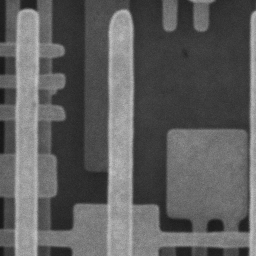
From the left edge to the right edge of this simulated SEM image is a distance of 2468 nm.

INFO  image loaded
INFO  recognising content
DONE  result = wiring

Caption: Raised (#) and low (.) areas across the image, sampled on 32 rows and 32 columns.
................................
...#...........#................
..###.........##...............#
..###.........###..............#
..###.........###..............#
..###.........###..............#
..###.........###..............#
..###.........###..............#
..###.........###..............#
..###.........###..............#
..###.........###..............#
..###.........###..............#
..###.........###..............#
..###.........###..............#
..###.........###..............#
..###.........###..............#
..###.........###..............#
..###.........###..............#
..###.........##...............#
..###.........##...............#
..###.........##...............#
..###.........##...............#
..###.........##...............#
..###.........##...............#
..###.........##...............#
..###.........##...............#
..###.........##...............#
..###.........##...............#
..###.........##...............#
..###.........##...............#
..###.........##...............#
..###.........##...............#